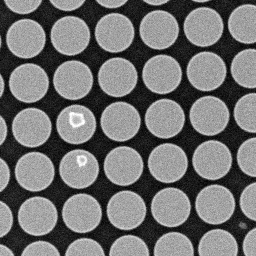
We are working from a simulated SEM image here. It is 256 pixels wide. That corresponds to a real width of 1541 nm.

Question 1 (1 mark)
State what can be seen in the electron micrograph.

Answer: an array of small figures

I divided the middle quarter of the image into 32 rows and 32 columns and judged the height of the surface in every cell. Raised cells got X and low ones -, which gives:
XXXXXX----XXXXXXX---XXXXXXXXX--X
XXXXXX---XXXXXXXXX--XXXXXXXXX--X
XXXXXXX--XXXXXXXXX--XXXXXXXXX--X
XXXXXXX--XXXXXXXXX--XXXXXXXXX--X
XXXXXXX--XXXXXXXXX--XXXXXXXXX---
XXXXXXX--XXXXXXXXX---XXXXXXX----
XXXXXX----XXXXXXX-----XXXXX-----
XXXXXX-----XXXXX----------------
XXXX----------------------------
-----------------------XXXX-----
--XX-------XXXXXX-----XXXXXXX---
XXXXXX----XXXXXXXX---XXXXXXXXX--
XXXXXXX---XXXXXXXXX--XXXXXXXXX--
XXXXXXXX-XXXXXXXXXX-XXXXXXXXXX--
XXXXXXXX-XXXXXXXXXX-XXXXXXXXXX--
XXXXXXXX-XXXXXXXXXX--XXXXXXXXX--
XXXXXXXX--XXXXXXXX---XXXXXXXX---
XXXXXXX---XXXXXXXX----XXXXXX----
XXXXXX------XXXXX---------------
-XXXX---------------------------
------------------------XXXX----
------------XXXXXX----XXXXXXXX--
-XXXXXX----XXXXXXXX---XXXXXXXX--
XXXXXXXX--XXXXXXXXX--XXXXXXXXXX-
XXXXXXXX--XXXXXXXXXX-XXXXXXXXXX-
XXXXXXXX--XXXXXXXXXX-XXXXXXXXXX-
XXXXXXXXX-XXXXXXXXXX-XXXXXXXXXX-
XXXXXXXX---XXXXXXXX---XXXXXXXX--
XXXXXXXX---XXXXXXXX----XXXXXX---
XXXXXXX-----XXXXX--------XX-----
--XXXX--------------------------
-------------------------XXXX---